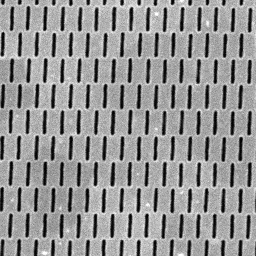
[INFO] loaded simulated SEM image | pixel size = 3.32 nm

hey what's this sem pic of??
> a regular array of holes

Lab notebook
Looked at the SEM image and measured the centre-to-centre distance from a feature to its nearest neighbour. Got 16.7 px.